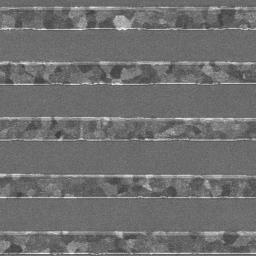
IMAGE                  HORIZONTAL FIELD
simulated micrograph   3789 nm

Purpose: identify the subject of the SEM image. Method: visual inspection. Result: lines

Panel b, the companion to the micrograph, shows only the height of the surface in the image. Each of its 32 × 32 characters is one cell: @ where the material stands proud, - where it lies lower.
--------------------------------
@@@@@@@@@@@@@@@@@@@@@@@@@@@@@@@@
@@@@@@@@@@@@@@@@@@@@@@@@@@@@@@@@
@@@@@@@@@@@@@@@@@@@@@@@@@@@@@@@@
--------------------------------
--------------------------------
--------------------------------
--------------------------------
@@@@@@@@@@@@@@@@@@@@@@@@@@@@@@@@
@@@@@@@@@@@@@@@@@@@@@@@@@@@@@@@@
--------------------------------
--------------------------------
--------------------------------
--------------------------------
--------------------------------
@@@@@@@@@@@@@@@@@@@@@@@@@@@@@@@@
@@@@@@@@@@@@@@@@@@@@@@@@@@@@@@@@
--------------------------------
--------------------------------
--------------------------------
--------------------------------
--------------------------------
@@@@@@@@@@@@@@@@@@@@@@@@@@@@@@@@
@@@@@@@@@@@@@@@@@@@@@@@@@@@@@@@@
@@@@@@@@@@@@@@@@@@@@@@@@@@@@@@@@
--------------------------------
--------------------------------
--------------------------------
--------------------------------
@@@@@@@@@@@@@@@@@@@@@@@@@@@@@@@@
@@@@@@@@@@@@@@@@@@@@@@@@@@@@@@@@
@@@@@@@@@@@@@@@@@@@@@@@@@@@@@@@@